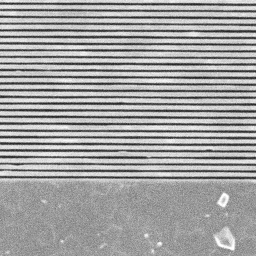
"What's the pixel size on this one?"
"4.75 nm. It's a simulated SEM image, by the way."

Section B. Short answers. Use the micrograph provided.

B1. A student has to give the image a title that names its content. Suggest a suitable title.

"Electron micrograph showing parallel lines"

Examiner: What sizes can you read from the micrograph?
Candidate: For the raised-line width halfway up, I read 0.0214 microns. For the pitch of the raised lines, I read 0.0317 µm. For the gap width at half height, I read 12.5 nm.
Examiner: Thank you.